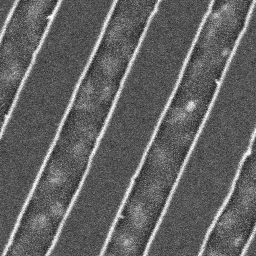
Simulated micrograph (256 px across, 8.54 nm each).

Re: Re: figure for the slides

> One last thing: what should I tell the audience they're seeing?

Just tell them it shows one or a few lines or trenches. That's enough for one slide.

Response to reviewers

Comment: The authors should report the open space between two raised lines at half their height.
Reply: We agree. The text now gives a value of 336 nm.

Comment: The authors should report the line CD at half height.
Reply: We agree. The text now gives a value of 438 nanometres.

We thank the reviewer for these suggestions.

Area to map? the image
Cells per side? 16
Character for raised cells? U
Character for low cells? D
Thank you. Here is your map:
UDDDUUUDDDUUUDDD
DDDUUUUDDUUUUDDU
DDDUUUDDDUUUDDDU
DDUUUUDDUUUUDDUU
DDUUUDDDUUUDDDUU
DUUUUDDDUUUDDDUU
DUUUDDDUUUUDDUUU
UUUUDDDUUUDDDUUU
UUUUDDUUUUDDUUUU
UUUDDDUUUDDDUUUU
UUUDDUUUUDDUUUUD
UUDDDUUUDDDUUUUD
UUDDDUUUDDDUUUDD
UDDDUUUDDDUUUUDD
UDDDUUUDDDUUUDDD
DDDUUUUDDUUUUDDU